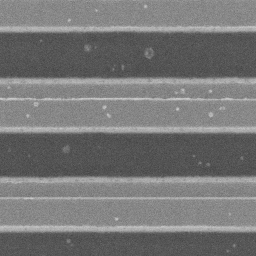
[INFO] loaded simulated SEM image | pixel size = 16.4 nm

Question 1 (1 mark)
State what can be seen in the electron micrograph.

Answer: lines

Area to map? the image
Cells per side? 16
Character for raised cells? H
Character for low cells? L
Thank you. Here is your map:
HHHHHHHHHHHHHHHH
HHHHHHHHHHHHHHHH
LLLLLLLLLLLLLLLL
LLLLLLLLLLLLLLLL
LLLLLLLLLLLLLLLL
HHHHHHHHHHHHHHHH
HHHHHHHHHHHHHHHH
HHHHHHHHHHHHHHHH
LLLLLLLLLLLLLLLL
LLLLLLLLLLLLLLLL
LLLLLLLLLLLLLLLL
HHHHHHHHHHHHHHHH
HHHHHHHHHHHHHHHH
HHHHHHHHHHHHHHHH
LLLLLLLLLLLLLLLL
LLLLLLLLLLLLLLLL